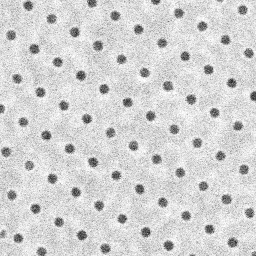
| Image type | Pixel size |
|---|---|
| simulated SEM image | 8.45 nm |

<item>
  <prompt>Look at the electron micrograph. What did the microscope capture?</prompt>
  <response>a regular array of holes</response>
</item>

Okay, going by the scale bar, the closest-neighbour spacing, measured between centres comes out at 224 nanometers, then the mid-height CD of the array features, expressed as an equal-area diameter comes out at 99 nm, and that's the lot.